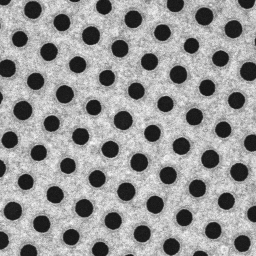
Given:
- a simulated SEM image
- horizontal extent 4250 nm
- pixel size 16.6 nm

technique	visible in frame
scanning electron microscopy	a regular array of holes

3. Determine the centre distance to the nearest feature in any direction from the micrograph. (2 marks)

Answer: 526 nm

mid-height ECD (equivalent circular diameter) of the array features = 17.4 px